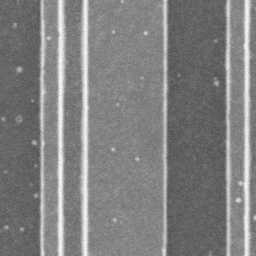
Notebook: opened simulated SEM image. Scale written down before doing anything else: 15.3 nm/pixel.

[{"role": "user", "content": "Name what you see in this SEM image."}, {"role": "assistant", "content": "lines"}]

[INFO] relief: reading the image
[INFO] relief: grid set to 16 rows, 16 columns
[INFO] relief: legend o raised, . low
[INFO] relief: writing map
...ooooooo....oo
...ooooooo....oo
...ooooooo....oo
...ooooooo....oo
...ooooooo....oo
...ooooooo....oo
...ooooooo....oo
...ooooooo....oo
...ooooooo....oo
...ooooooo....oo
...ooooooo....oo
...ooooooo....oo
...ooooooo....oo
...ooooooo....oo
...ooooooo....oo
...ooooooo....oo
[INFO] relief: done